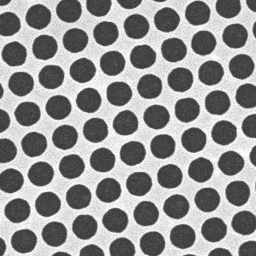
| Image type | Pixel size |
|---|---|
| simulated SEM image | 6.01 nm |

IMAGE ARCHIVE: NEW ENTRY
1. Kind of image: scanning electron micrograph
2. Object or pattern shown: a regular array of holes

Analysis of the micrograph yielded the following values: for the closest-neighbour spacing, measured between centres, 184 nm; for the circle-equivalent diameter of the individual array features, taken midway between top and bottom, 155 nm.